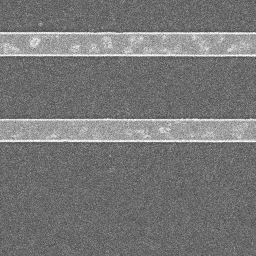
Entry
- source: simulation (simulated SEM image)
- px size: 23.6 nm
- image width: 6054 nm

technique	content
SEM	one or a few lines or trenches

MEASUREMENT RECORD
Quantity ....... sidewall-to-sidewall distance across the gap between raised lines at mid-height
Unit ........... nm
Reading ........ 1510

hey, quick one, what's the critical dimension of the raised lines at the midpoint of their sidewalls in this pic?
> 526 nanometers